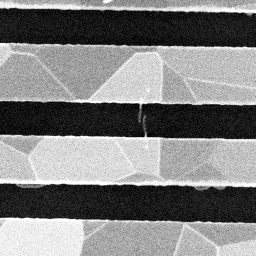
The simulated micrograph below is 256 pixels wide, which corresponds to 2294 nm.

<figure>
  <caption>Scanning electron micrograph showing lines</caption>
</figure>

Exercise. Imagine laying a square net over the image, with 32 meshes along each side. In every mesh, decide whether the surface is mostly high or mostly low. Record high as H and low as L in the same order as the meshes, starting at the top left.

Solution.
HHHHHHHHHHHHHHHHHHHHHHHHHHHHHHHH
LLLLLLLLLLLLLLLLLLLLLLLLLLLLLLLL
LLLLLLLLLLLLLLLLLLLLLLLLLLLLLLLL
LLLLLLLLLLLLLLLLLLLLLLLLLLLLLLLL
LLLLLLLLLLLLLLLLLLLLLLLLLLLLLLLL
HHHHLLLLLLLLLLLLLLLLLLLLLLLLLLLL
HHHHHHHHHHHHHHHHHHHHHHHHHHHHHHHH
HHHHHHHHHHHHHHHHHHHHHHHHHHHHHHHH
HHHHHHHHHHHHHHHHHHHHHHHHHHHHHHHH
HHHHHHHHHHHHHHHHHHHHHHHHHHHHHHHH
HHHHHHHHHHHHHHHHHHHHHHHHHHHHHHHH
HHHHHHHHHHHHHHHHHHHHHHHHHHHHHHHH
HHHHHHHHHHHHHHHHHHHHHHHHHHHHHHHH
LLLLLLLLLLLLLLLLLLLLLLLLLLLLLLLL
LLLLLLLLLLLLLLLLLLLLLLLLLLLLLLLL
LLLLLLLLLLLLLLLLLLLLLLLLLLLLLLLL
LLLLLLLLLLLLLLLLLLLLLLLLLLLLLLLL
HHHHHHHHHHHHHHHHHHHHHHHHHHHHHHHH
HHHHHHHHHHHHHHHHHHHHHHHHHHHHHHHH
HHHHHHHHHHHHHHHHHHHHHHHHHHHHHHHH
HHHHHHHHHHHHHHHHHHHHHHHHHHHHHHHH
HHHHHHHHHHHHHHHHHHHHHHHHHHHHHHHH
HHHHHHHHHHHHHHHHHHHHHHHHHHHHHHHH
LLLLLLLLLLLLLLLLLLLLLLLLLLLLLLLL
LLLLLLLLLLLLLLLLLLLLLLLLLLLLLLLL
LLLLLLLLLLLLLLLLLLLLLLLLLLLLLLLL
LLLLLLLLLLLLLLLLLLLLLLLLLLLLLLLL
HHHHHHHHHHLLLLLLLLLLLLLLLLLLLLLL
HHHHHHHHHHHHHHHHHHHHHHHHHHHHHHHH
HHHHHHHHHHHHHHHHHHHHHHHHHHHHHHHH
HHHHHHHHHHHHHHHHHHHHHHHHHHHHHHHH
HHHHHHHHHHHHHHHHHHHHHHHHHHHHHHHH